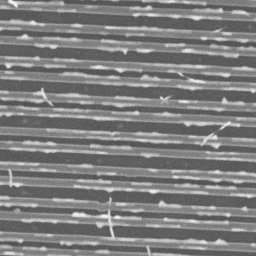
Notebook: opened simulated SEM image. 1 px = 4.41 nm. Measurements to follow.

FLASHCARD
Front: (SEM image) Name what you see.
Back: parallel lines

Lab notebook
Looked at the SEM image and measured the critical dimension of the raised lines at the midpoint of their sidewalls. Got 38.5 nm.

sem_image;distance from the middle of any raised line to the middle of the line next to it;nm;78.1